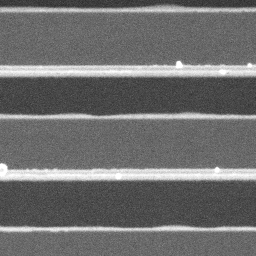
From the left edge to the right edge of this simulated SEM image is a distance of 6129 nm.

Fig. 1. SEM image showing lines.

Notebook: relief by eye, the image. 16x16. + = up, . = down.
................
++++++++++++++++
++++++++++++++++
++++++++++++++++
++++++.+.....++.
................
................
++++++++++++++++
++++++++++++++++
++++++++++++++++
++++++++++++++++
................
................
................
++++++++++++++++
++++++++++++++++